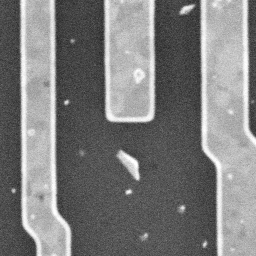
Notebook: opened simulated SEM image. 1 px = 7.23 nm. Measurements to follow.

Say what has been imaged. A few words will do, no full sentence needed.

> groups of lines, slits or small figures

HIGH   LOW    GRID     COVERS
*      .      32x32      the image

...****......******......******.
...****......******......******.
...****......******......******.
...****......******......******.
...****......******......******.
...****......******......******.
...****......******.......*****.
...****......******.......*****.
...****......******.......*****.
...****......******.......*****.
...****.......*****.......*****.
...****.......*****.......*****.
...****.......*****.......*****.
...****.......*****.......*****.
...****.......*****.......*****.
...****...................*****.
...****...................*****.
...****...................******
...****...................******
...****...................******
...****....................*****
...****....................*****
...****....................*****
...****....................*****
...****....................*****
...****....................*****
...****....................*****
...*****...................*****
...*****...................*****
....****...................*****
.....***...................*****
.....***...................*****